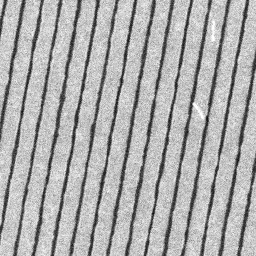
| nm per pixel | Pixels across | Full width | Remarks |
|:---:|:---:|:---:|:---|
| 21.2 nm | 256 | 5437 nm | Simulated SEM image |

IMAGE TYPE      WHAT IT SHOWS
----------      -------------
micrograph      parallel lines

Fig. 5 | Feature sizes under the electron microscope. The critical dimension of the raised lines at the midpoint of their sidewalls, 293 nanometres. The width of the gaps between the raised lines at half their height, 83.6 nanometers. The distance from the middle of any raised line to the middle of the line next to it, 0.39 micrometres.